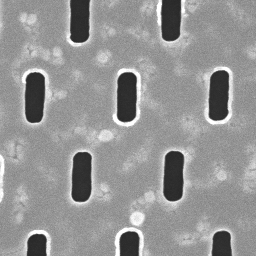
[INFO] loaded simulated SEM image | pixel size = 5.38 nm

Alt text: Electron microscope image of holes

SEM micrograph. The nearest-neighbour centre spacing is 494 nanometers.